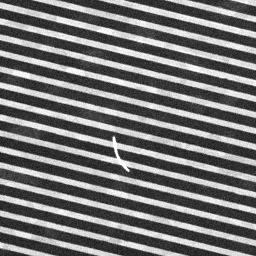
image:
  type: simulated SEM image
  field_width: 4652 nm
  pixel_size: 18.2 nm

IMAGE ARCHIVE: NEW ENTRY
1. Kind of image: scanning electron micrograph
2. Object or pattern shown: parallel lines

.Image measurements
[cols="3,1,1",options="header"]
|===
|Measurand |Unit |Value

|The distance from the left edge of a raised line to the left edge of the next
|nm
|282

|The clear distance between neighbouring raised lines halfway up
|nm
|192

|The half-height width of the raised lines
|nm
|90.5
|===